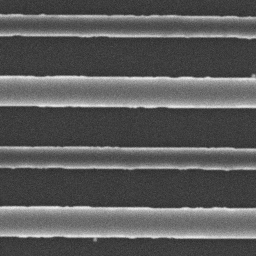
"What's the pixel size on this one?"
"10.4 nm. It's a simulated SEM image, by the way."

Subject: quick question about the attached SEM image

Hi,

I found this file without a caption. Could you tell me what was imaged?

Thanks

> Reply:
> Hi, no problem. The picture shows lines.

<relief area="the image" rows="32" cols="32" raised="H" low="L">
LLLLLLLLLLLLLLLLLLLLLLLLLLLLLLLL
LLLLLLLLLLLLLLLLLLLLLLLLLLLLLLLL
HHHHHHHHHHHHHHHHHHHHHHHHHHHHHHHH
HHHHHHHHHHHHHHHHHHHHHHHHHHHHHHHH
LLLLLLLLLLHHLLHHHHHHHHHHHHHHHHHH
LLLLLLLLLLLLLLLLLLLLLLLLLLLLLLLL
LLLLLLLLLLLLLLLLLLLLLLLLLLLLLLLL
LLLLLLLLLLLLLLLLLLLLLLLLLLLLLLLL
LLLLLLLLLLLLLLLLLLLLLLLLLLLLLLLL
LLLLLLLLLLLLLLLLLLLLLLLLLLLLLLLL
HHHHHHHHHHHHHHHHHHHHHHHHHHHHHHHH
HHHHHHHHHHHHHHHHHHHHHHHHHHHHHHHH
HHHHHHHHHHHHHHHHHHHHHHHHHHHHHHHH
LLLLLLLLLLLLLLLLLLLLLLLLLLLLLLLL
LLLLLLLLLLLLLLLLLLLLLLLLLLLLLLLL
LLLLLLLLLLLLLLLLLLLLLLLLLLLLLLLL
LLLLLLLLLLLLLLLLLLLLLLLLLLLLLLLL
LLLLLLLLLLLLLLLLLLLLLLLLLLLLLLLL
HHHHHHHHHHHHHHLLLLLLLLLLLLLLLLLL
HHHHHHHHHHHHHHHHHHHHHHHHHHHHHHHH
HHHHHHHHHHHHHHHHHHHHHHHHHHHHHHHH
LLLLLLLLLLLLLLLLLLLLLLLLLLLLLLLL
LLLLLLLLLLLLLLLLLLLLLLLLLLLLLLLL
LLLLLLLLLLLLLLLLLLLLLLLLLLLLLLLL
LLLLLLLLLLLLLLLLLLLLLLLLLLLLLLLL
LLLLLLLLLLLLLLLLLLLLLLLLLLLLLLLL
HHHHHHHHHHHHHHHHHHHHHHHHHHHHHHHH
HHHHHHHHHHHHHHHHHHHHHHHHHHHHHHHH
HHHHHHHHHHHHHHHHHHHHHHHHHHHHHHHH
LLHHHHHLHHHHHHHHHHHHHHHHHHHHHHHH
LLLLLLLLLLLLLLLLLLLLLLLLLLLLLLLL
LLLLLLLLLLLLLLLLLLLLLLLLLLLLLLLL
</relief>